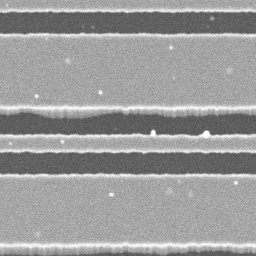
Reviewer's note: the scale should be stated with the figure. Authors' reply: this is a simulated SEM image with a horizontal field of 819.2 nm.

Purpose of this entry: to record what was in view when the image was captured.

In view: lines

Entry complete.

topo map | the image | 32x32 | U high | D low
UUUUUUUUUUUUUUUUUUUUUUUUUUUUUUUU
UDDDDDDDDDDDDDDDDDDDDDDDDDDDDDDD
DDDDDDDDDDDDDDDDDDDDDDDDDDDDDDDD
DDDDDDDDDDDDDDDDDDDDDDDDDDDDDDDD
UUUUUUUUUUUUUUUUUUUUUUUUUUUUUUUU
UUUUUUUUUUUUUUUUUUUUUUUUUUUUUUUU
UUUUUUUUUUUUUUUUUUUUUUUUUUUUUUUU
UUUUUUUUUUUUUUUUUUUUUUUUUUUUUUUU
UUUUUUUUUUUUUUUUUUUUUUUUUUUUUUUU
UUUUUUUUUUUUUUUUUUUUUUUUUUUUUUUU
UUUUUUUUUUUUUUUUUUUUUUUUUUUUUUUU
UUUUUUUUUUUUUUUUUUUUUUUUUUUUUUUU
UUUUUUUUUUUUUUUUUUUUUUUUUUUUUUUU
UUUUUUUUUUUUUUUUUUUUUUUUUUUUUUUU
DDDDDDDDDDDDDDDDDDDDDDDDDDDDDDDD
DDDDDDDDDDDDDDDDDDDDDDDDDDDDDDDD
DDDDDDDDDDDDDDDDDDDDDDDDDDDDDDDD
UUUUUUUUUUUUUUUUUUUUUUUUUUUUUUUU
UUUUUUUUUUUUUUUUUUUUUUUUUUUUUUUU
DDDDDDDDDDDDDDDDDDDDDDDDDDDDDDDD
DDDDDDDDDDDDDDDDDDDDDDDDDDDDDDDD
DDDDDDDDDDDDDDDDDDDDDDDDDDDDDDDD
UUUUUUUUUUUUUUUUUUUUUUUUUUUUUUUU
UUUUUUUUUUUUUUUUUUUUUUUUUUUUUUUU
UUUUUUUUUUUUUUUUUUUUUUUUUUUUUUUU
UUUUUUUUUUUUUUUUUUUUUUUUUUUUUUUU
UUUUUUUUUUUUUUUUUUUUUUUUUUUUUUUU
UUUUUUUUUUUUUUUUUUUUUUUUUUUUUUUU
UUUUUUUUUUUUUUUUUUUUUUUUUUUUUUUU
UUUUUUUUUUUUUUUUUUUUUUUUUUUUUUUU
UUUUUUUUUUUUUUUUUUUUUUUUUUUUUUUU
DDDDDDDDDDDDDDDDDDDDDDDDDDDDDDDD